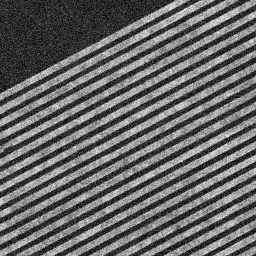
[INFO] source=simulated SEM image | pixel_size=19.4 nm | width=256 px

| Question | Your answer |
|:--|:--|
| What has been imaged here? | parallel lines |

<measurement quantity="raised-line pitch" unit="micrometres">0.224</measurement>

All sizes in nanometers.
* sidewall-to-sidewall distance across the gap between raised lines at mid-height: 113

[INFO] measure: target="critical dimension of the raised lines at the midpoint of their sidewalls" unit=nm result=113